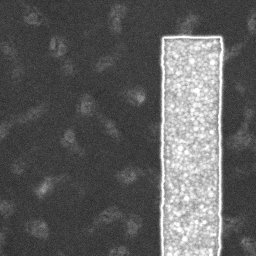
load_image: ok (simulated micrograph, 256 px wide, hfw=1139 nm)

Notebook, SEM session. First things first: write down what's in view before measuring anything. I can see one or a few lines or trenches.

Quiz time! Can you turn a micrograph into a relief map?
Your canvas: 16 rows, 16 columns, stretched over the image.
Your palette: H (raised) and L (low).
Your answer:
HHHHHHHHHHHHHHHH
HHHHHHHHHHHHHHHH
HHHHHHHHHHLLLHHH
HHHHHHHHHHLLLLHH
HHHHHHHHHHLLLLHH
HHHHHHHHHHLLLLHH
HHHHHHHHHHLLLLHH
HHHHHHHHHHLLLLHH
HHHHHHHHHHLLLLHH
HHHHHHHHHHLLLLHH
HHHHHHHHHHLLLLHH
HHHHHHHHHHLLLLHH
HHHHHHHHHHLLLLHH
HHHHHHHHHHLLLLHH
HHHHHHHHHHLLLLHH
HHHHHHHHHHLLLLHH